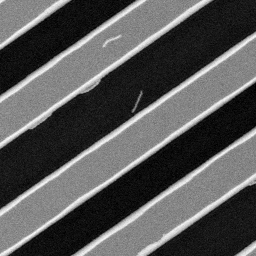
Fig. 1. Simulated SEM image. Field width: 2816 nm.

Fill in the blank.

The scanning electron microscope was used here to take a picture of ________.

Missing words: lines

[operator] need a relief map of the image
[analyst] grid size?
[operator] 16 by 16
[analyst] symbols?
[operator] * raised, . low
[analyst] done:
****....****....
**....*****.....
*....*****.....*
....****......**
..*****.....****
.****......****.
****......****..
***.....*****...
*......****....*
.....*****....**
....****....****
..*****....*****
.****.....****..
****....*****...
***....****.....
*....*****.....*